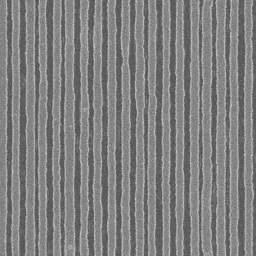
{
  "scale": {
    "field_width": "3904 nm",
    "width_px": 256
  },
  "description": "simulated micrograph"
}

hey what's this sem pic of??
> parallel lines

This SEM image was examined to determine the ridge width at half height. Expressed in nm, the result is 120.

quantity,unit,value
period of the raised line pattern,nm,209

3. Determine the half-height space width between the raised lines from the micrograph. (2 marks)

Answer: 91.5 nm